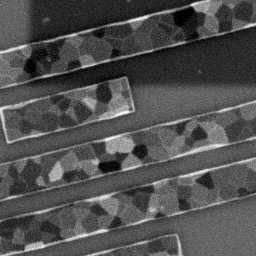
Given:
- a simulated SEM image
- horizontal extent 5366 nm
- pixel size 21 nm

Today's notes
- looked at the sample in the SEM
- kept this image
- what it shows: groups of lines, slits or small figures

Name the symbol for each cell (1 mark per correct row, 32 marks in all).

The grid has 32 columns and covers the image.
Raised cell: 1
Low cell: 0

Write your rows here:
00000000000000000000000011111111
00000000000000000000011111111111
00000000000000000111111111111111
00000000000011111111111111111100
00000000011111111111111111100000
00001111111111111111110000000000
11111111111111111100000000000000
11111111111111000000000000000000
11111111110000000000000000000000
11111100000000000000000000000000
11000000000011110000000000000000
00000000111111110000000000000000
00001111111111110000000000000000
11111111111111111000000000000111
11111111111111100000000001111111
11111111110000000000011111111111
01111110000000000111111111111111
01000000000001111111111111111110
00000000011111111111111111000000
00000111111111111111111000000000
11111111111111111100000000000111
11111111111111000000000001111111
11111111111000000000011111111111
11111110000000001111111111111111
11100000000000111111111111111110
00000000111111111111111111100000
00000111111111111111111000000000
11111111111111111100000000000000
11111111111111100000000000000000
11111111110000000000010000000000
11111100000000000111110000000000
11100000000001111111110000000000